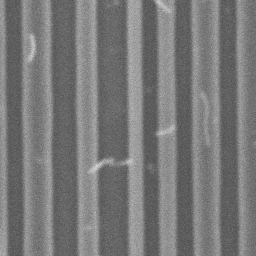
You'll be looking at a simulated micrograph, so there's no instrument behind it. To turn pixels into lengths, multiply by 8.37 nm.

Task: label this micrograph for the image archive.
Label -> groups of lines, slits or small figures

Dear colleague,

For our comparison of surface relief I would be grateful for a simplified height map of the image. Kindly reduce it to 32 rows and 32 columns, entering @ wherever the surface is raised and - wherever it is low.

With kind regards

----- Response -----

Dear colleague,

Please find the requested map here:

@--@@@----@@----@@--@@--@@@---@@
@--@@@----@@----@@--@@--@@@---@@
@--@@@----@@----@@--@@--@@@---@@
@--@@@----@@----@@--@@--@@@---@@
@--@@@----@@----@@--@@--@@@---@@
@--@@@----@@----@@--@@--@@@---@@
@--@@@----@@----@@--@@--@@@---@@
@--@@@----@@----@@--@@--@@@---@@
@--@@@----@@----@@--@@--@@@---@@
@--@@@----@@----@@--@@--@@@---@@
@--@@@----@@----@@--@@--@@@---@@
@--@@@----@@----@@--@@--@@@---@@
@--@@@----@@----@@--@@--@@@---@@
@--@@@----@@----@@--@@--@@@---@@
@--@@@----@@----@@--@@--@@@---@@
@--@@@----@@----@@--@@--@@@---@@
@--@@@----@@----@@--@@--@@@---@@
@--@@@----@@----@@--@@--@@@---@@
@--@@@----@@----@@--@@--@@@---@@
@--@@@----@@----@@--@@--@@@---@@
@--@@@----@@----@@--@@--@@@---@@
@--@@@----@@----@@--@@--@@@---@@
@--@@@----@@----@@--@@--@@@---@@
@--@@@----@@----@@--@@--@@@---@@
@--@@@----@@----@@--@@--@@@---@@
@--@@@----@@----@@--@@--@@@---@@
@--@@@----@@----@@--@@--@@@---@@
@--@@@----@@----@@--@@--@@@---@@
@--@@@----@@----@@--@@--@@@---@@
@--@@@----@@----@@--@@--@@@---@@
@--@@@@---@@----@@--@@--@@@@--@@
@--@@@@---@@----@@--@@--@@@@--@@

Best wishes